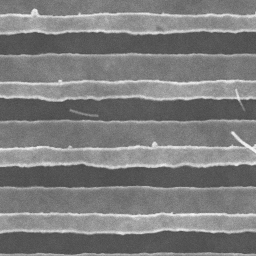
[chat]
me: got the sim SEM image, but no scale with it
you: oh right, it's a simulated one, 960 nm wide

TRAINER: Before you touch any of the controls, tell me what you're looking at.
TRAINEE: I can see lines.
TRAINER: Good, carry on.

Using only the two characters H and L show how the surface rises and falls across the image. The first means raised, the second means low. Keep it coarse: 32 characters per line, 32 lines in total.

HHHHHHHHHHHHHHHHHHHHHHHHHHHHHHHH
HHHHHHHHHHHHHHHHHHHHHHHHHHHHHHHH
HHHHHHHHHHHHHHHHHHHHHHHHHHHHHHHH
HHHHHHHHHHHHHHHHHHHHHHHHHHHHHHHH
LLLLLLLLLLLLLLLLLLLLLLLLLLLLLLLL
LLLLLLLLLLLLLLLLLLLLLLLLLLLLLLLL
LLLLLLLLLLLLLLLLLLLLLLLLLLLLLLLL
HHHHHHHHHHHHHHHHHHHHHHHHHHHHHHHH
HHHHHHHHHHHHHHHHHHHHHHHHHHHHHHHH
HHHHHHHHHHHHHHHHHHHHHHHHHHHHHHHH
HHHHHHHHHHHHHHHHHHHHHHHHHHHHHHHH
HHHHHHHHHHHHHHHHHHHHHHHHHHHHHHHH
LLLLLHHHLLLLLLLLLLLHHLLLLLLLLLLL
LLLLLLLLLLLLLLLLLLLLLLLLLLLLLLLL
LLLLLLLLLLLLLLLLLLLLLLLLLLLLLLLL
HHHHHHHHHHHHHHHHHHHHHHHHHHHHHHHH
HHHHHHHHHHHHHHHHHHHHHHHHHHHHHHHH
HHHHHHHHHHHHHHHHHHHHHHHHHHHHHHHH
HHHHHHHHHHHHHHHHHHHHHHHHHHHHHHHH
HHHHHHHHHHHHHHHHHHHHHHHHHHHHHHHH
HHHHHHHHHHHHHHHHHHHHHHHHHHHHHHLH
LLLLLLLLLLLLLLLLLLLLLLLLLLLLLLLL
LLLLLLLLLLLLLLLLLLLLLLLLLLLLLLLL
HHLHHHHHHLHHHHHHHHHHLLHHHLLHHHHH
HHHHHHHHHHHHHHHHHHHHHHHHHHHHHHHH
HHHHHHHHHHHHHHHHHHHHHHHHHHHHHHHH
HHHHHHHHHHHHHHHHHHHHHHHHHHHHHHHH
HHHHHHHHHHHHHHHHHHHHHHHHHHHHHHHH
HHHHHHHHHHHHHHHHHHHHHHHHHHHHHHHH
LLLLLLLLLLLLLLLLLLLLLLLLLLLLLLLL
LLLLLLLLLLLLLLLLLLLLLLLLLLLLLLLL
LLLLLLLLLLLLLLLLLLLLLLLLLLLLLLLL